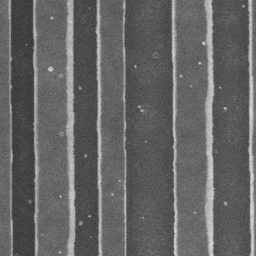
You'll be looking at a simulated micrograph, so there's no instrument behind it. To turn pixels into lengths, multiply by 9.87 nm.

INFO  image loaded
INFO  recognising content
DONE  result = lines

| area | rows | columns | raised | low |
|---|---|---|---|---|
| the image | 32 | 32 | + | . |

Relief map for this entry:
+...+++++...++++......++++.....+
+...+++++...++++......++++.....+
+...+++++...++++......++++.....+
+...+++++...+++.......++++.....+
+...+++++...+++.......++++.....+
+...+++++...+++.......++++.....+
+...+++++...++++......++++.....+
+...+++++...++++......++++.....+
+...+++++...++++......++++.....+
+...+++++...++++......++++.....+
+...+++++...++++......++++.....+
+...+++++...++++......++++.....+
+...+++++...++++......++++.....+
+...+++++...++++......++++.....+
+...+++++...++++......++++.....+
+...+++++...++++......++++.....+
+...+++++...++++......++++.....+
+...+++++...++++......++++.....+
+...+++++...++++......++++.....+
+...+++++...++++......++++.....+
+...+++++...++++......++++.....+
+...+++++...++++......++++.....+
+...+++++...++++......++++.....+
+...+++++...++++......++++.....+
+...+++++....+++......++++.....+
+...+++++....+++......++++.....+
+...+++++....+++......++++.....+
+...+++++....+++......++++.....+
+...+++++....+++......++++.....+
+...+++++...++++......++++......
+...+++++...++++......++++......
+...+++++....+++......++++.....+